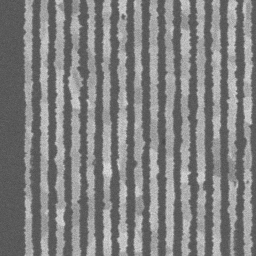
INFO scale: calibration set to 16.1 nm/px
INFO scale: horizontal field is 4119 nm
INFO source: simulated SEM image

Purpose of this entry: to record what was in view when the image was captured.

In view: parallel lines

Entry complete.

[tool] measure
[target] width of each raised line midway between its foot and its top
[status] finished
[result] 0.111 microns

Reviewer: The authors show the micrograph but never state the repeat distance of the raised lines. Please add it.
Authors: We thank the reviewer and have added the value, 252 nm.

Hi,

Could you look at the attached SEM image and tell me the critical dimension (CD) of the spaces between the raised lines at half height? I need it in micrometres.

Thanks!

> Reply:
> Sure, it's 0.141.